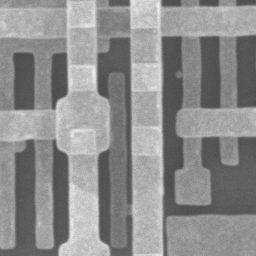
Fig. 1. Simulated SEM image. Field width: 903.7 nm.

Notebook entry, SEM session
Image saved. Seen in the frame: wiring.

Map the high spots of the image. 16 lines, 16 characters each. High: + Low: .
....++..++......
....++..++......
....++..++......
....++..++......
....++..++......
....++..++......
....+++.++......
....+++.++......
....+++.++......
....++..++......
....++..++......
....++..++......
....++..++......
....++..++......
....++..++......
....+++.++......